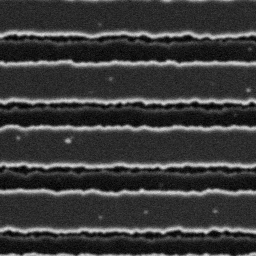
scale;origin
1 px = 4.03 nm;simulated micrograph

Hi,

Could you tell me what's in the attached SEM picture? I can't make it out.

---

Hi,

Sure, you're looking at lines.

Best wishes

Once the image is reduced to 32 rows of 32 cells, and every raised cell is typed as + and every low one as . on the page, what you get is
++++++++++++++++++++++++++++++++
++++++++++++++++++++++++++++++++
++++++++++++++++++++++++++++++++
++++++++++++++++++++++++++++++++
+..........++......++...++++++..
................................
................................
................................
++++++++++++++++++++++++++++++++
++++++++++++++++++++++++++++++++
++++++++++++++++++++++++++++++++
++++++++++++++++++++++++++++++++
++++++++++++++++++++++++++++++++
................................
................................
................................
++++++++++++++++++++++++++++++++
++++++++++++++++++++++++++++++++
++++++++++++++++++++++++++++++++
++++++++++++++++++++++++++++++++
++++++++++++++++++++++++++++++++
................................
................................
................................
++++++++++++++++++++++++++++++++
++++++++++++++++++++++++++++++++
++++++++++++++++++++++++++++++++
++++++++++++++++++++++++++++++++
++++++++++++++++++++++++++++++++
................................
................................
................................